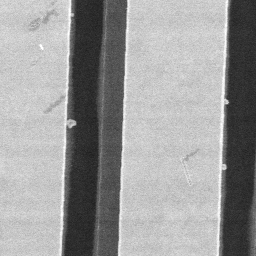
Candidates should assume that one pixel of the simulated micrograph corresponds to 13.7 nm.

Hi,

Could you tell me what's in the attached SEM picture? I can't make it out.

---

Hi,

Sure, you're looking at lines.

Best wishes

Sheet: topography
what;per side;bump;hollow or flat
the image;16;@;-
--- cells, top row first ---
@@@@----@@@@@@--
@@@@----@@@@@@--
@@@@----@@@@@@--
@@@@----@@@@@@--
@@@@----@@@@@@--
@@@@----@@@@@@--
@@@@----@@@@@@--
@@@@----@@@@@@--
@@@@----@@@@@@--
@@@@----@@@@@@--
@@@@----@@@@@@--
@@@@----@@@@@@--
@@@@----@@@@@@--
@@@@---@@@@@@@--
@@@@---@@@@@@@--
@@@@---@@@@@@@--